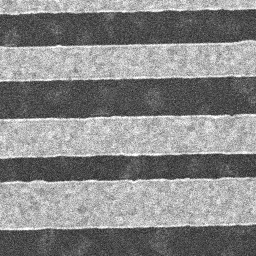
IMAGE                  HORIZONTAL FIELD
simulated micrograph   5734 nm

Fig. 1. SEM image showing one or a few lines or trenches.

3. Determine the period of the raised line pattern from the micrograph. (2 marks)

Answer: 1.59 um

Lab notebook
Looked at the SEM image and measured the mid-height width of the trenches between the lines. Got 776 nanometres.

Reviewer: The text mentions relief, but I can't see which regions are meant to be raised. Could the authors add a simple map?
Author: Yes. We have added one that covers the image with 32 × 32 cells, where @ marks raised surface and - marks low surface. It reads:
@@@@@@@@@@@@@@@@@@@@@@@@@@@@@@@@
@@@@-@@--@@@----@---------------
--------------------------------
--------------------------------
--------------------------------
-----------------------------@@@
@@@@@@@@@@@@@@@@@@@@@@@@@@@@@@@@
@@@@@@@@@@@@@@@@@@@@@@@@@@@@@@@@
@@@@@@@@@@@@@@@@@@@@@@@@@@@@@@@@
@@@@@@@@@@@@@@@@@@@@@@@@@@@@@---
--------------------------------
--------------------------------
--------------------------------
--------------------------------
------------------------@---@@@@
@@@@@@@@@@@@@@@@@@@@@@@@@@@@@@@@
@@@@@@@@@@@@@@@@@@@@@@@@@@@@@@@@
@@@@@@@@@@@@@@@@@@@@@@@@@@@@@@@@
@@@@@@@@@@@@@@@@@@@@@@@@@@@@@@@@
@@@@@@@--@----------------------
--------------------------------
--------------------------------
-------------------@@--@@@@@@@@@
@@@@@@@@@@@@@@@@@@@@@@@@@@@@@@@@
@@@@@@@@@@@@@@@@@@@@@@@@@@@@@@@@
@@@@@@@@@@@@@@@@@@@@@@@@@@@@@@@@
@@@@@@@@@@@@@@@@@@@@@@@@@@@@@@@@
@@@@@@@@@@@@@@@@@@@@@@@@@@@@@@@@
@@@@@--@@-----------------------
--------------------------------
--------------------------------
--------------------------------